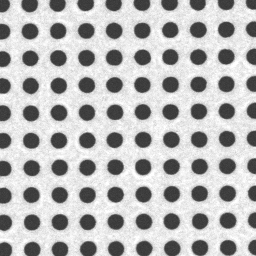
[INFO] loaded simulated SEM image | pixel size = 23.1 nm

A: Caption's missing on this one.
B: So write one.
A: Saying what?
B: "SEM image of a regular array of holes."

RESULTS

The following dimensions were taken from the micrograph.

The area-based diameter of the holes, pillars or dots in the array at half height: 384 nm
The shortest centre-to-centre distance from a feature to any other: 626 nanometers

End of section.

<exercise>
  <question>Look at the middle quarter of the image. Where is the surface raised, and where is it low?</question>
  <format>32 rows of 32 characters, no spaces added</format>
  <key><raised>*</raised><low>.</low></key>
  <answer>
*****..*****.*******************
********************************
********************************
*****.******..****...****...****
.***....***....***...****....***
.***....**.....**.....**.....***
.***...****...****...****...****
********************************
********************************
********************************
****...****...****...****...****
.***....***....***....***....***
.***....***....***....***....***
****...****...****...****...****
********************************
********************************
********************************
****...****...****...****...****
.***....***....***....***....***
.***....***....***....***....***
****...****...*****..****...****
********************************
********************************
********************************
****....***....***...****....***
.***....***....***....***....***
.***....***....***....***....***
*****..*****..*****..*****..****
********************************
********************************
***************************.****
.***....***....***....***....***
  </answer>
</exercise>